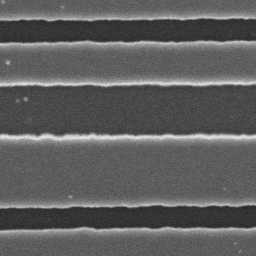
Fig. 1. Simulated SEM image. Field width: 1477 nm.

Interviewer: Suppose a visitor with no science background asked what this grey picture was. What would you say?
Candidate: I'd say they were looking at lines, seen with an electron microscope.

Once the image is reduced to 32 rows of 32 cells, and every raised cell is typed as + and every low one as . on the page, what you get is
++++++++++++++++++++++++++++++++
++++++++++++++++++++++++++++++++
......+....+....................
................................
................................
++++++++++++++++++++++++++++++++
++++++++++++++++++++++++++++++++
++++++++++++++++++++++++++++++++
++++++++++++++++++++++++++++++++
++++++++++++++++++++++++++++++++
++++.++++++++++++.......++......
................................
................................
................................
................................
................................
................................
++++++++++++++++++++++++++++++++
++++++++++++++++++++++++++++++++
++++++++++++++++++++++++++++++++
++++++++++++++++++++++++++++++++
++++++++++++++++++++++++++++++++
++++++++++++++++++++++++++++++++
++++++++++++++++++++++++++++++++
++++++++++++++++++++++++++++++++
++++++++++++++++++++++++++++++++
................................
................................
................................
++++++++++++++++++++++++++++++++
++++++++++++++++++++++++++++++++
++++++++++++++++++++++++++++++++